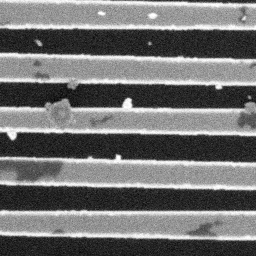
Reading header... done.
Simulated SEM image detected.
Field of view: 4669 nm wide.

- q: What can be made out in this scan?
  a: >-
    lines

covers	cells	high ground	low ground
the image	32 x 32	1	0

11111111111111111111111000000000
11111111111111111111111111111111
11111111111111111111111111111111
00000000000000000000111100001111
00000000000000000000000000000000
00000000000000000000000000000000
00000000000000000000000000000000
11111111111111111111111111111000
11111111111111111111111111111111
11111111111111111111111111111111
00000000110000000000000000011111
00000000000000000000000000000000
00000000000000000000000000000000
00000111100000010000000000000011
11111111111111111111111111111111
11111111111111111111111111111111
01000000000000000011111111111111
00000000000000000000000000000000
00000000000000000000000000000000
00000000000000000000000000000000
11111111111111111111111111111000
11111111111111111111111111111111
11111111111111111111111111111111
00000000000000000000000000001111
00000000000000000000000000000000
00000000000000000000000000000000
00000000000000000000000000000000
11111111111111111111111111111111
11111111111111111111111111111111
00000000000000000111111111111111
00000000000000000000000000000000
00000000000000000000000000000000